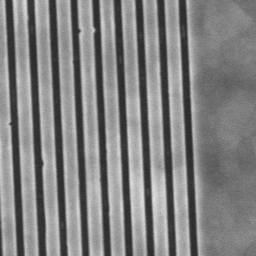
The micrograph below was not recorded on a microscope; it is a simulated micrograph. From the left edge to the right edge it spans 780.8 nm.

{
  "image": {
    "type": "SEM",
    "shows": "parallel lines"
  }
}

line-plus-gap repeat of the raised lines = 66 nm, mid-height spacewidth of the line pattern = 25.5 nm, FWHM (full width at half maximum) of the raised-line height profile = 42.2 nm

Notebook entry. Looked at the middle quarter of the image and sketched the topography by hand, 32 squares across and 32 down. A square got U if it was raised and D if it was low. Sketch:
UUDDUUUDDDUUUDDUUUDDDUUUDDUUUDDU
UUDDUUUUDDUUUDDUUUDDDUUUDDUUUDDU
UUDDDUUUDDUUUDDUUUDDDUUUDDUUUDDU
UUDDDUUUDDUUUDDUUUUDDUUUDDUUUDDU
UUDDDUUUDDUUUDDUUUUDDUUUDDUUUDDD
UUDDDUUUDDUUUDDUUUUDDUUUDDUUUUDD
UUDDDUUUDDUUUDDUUUUDDUUUDDUUUUDD
UUDDDUUUDDUUUDDUUUUDDUUUDDUUUUDD
UUDDDUUUDDUUUDDUUUUDDUUUDDUUUUDD
UUUDDUUUDDUUUDDDUUUDDUUUDDUUUUDD
UUUDDUUUDDUUUDDDUUUDDUUUDDUUUUDD
UUUDDUUUDDUUUUDDUUUDDUUUDDDUUUDD
UUUDDUUUDDUUUUDDUUUDDUUUDDDUUUDD
UUUDDUUUDDUUUUDDUUUDDUUUDDDUUUDD
UUUDDUUUDDUUUUDDUUUDDUUUDDDUUUDD
UUUDDUUUDDUUUUDDUUUDDUUUDDDUUUDD
UUUDDUUUDDDUUUDDUUUDDUUUDDDUUUDD
UUUDDUUUDDDUUUDDUUUDDUUUDDDUUUDD
UUUDDUUUUDDUUUDDUUUDDDUUUDDUUUDD
UUUDDUUUDDDUUUDDUUUDDDUUUDDUUUDD
UUUDDUUUDDDUUUDDUUUDDDUUUDDUUUDD
UUUDDUUUDDDUUUDDUUUDDDUUUDDUUUDD
UUUDDUUUDDDUUUDDUUUDDDUUUDDUUUDD
UUUDDUUUUDDUUUDDUUUDDDUUUDDUUUDD
UUUDDDUUUDDUUUDDUUUDDDUUUDDUUUDD
UUUDDDUUUDDUUUDDUUUUDDUUUDDUUUDD
UUUDDDUUUDDUUUDDUUUUDDUUUDDUUUDD
UUUDDDUUUDDUUUDDUUUUDDUUUDDUUUUD
UUUDDDUUUDDUUUDDUUUUDDUUUDDUUUUD
UUUDDDUUUDDUUUDDUUUUDDUUUDDUUUUD
UUUUDDUUUDDUUUDDUUUUDDUUUDDUUUUD
UUUUDDUUUDDUUUDDDUUUDDUUUDDUUUUD